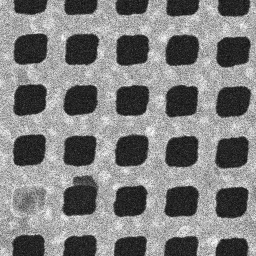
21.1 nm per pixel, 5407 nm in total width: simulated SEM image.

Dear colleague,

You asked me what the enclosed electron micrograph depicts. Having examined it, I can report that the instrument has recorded a regular array of holes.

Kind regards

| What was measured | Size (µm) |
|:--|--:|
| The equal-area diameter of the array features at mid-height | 0.728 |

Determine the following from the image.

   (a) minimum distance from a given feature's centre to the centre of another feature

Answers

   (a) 1050 nm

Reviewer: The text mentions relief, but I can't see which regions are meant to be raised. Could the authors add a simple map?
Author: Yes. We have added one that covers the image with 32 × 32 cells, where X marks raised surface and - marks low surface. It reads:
XX----XX----XX-----XX----XX----X
XX---XXX----XXX---XXX----XX----X
XXXXXXXXXXXXXXXXXXXXXXXXXXXXXXXX
XXXXXXXXXXXXXXXXXXXXXXXXXXXXXXXX
XXX---XXX---XXX---XXXX--XXXXXXXX
XX----XX----XX-----XX----XX----X
XX----XX----XX-----XX----XX----X
XX---XXX----XXX---XXX----XX----X
XXXXXXXXXXXXXXXXXXXXXXXXXXXXXXXX
XXXXXXXXXXXXXXXXXXXXXXXXXXXXXXXX
XXXXXXXXXXXXXXXXXXXXXXXXXXXXXXXX
XX----XX----XXX----XX----XX----X
XX----XX----XX-----XX----XX----X
XX----XX----XX----XXX----XX----X
XXXXXXXXXXXXXXX--XXXX--XXXX---XX
XXXXXXXXXXXXXXXXXXXXXXXXXXXXXXXX
XXXXXXXXXXXXXXXXXXXXXXXXXXXXXXXX
XX----XX----XXX----XX----XXX---X
XX----XX----XX-----XX----XX----X
XX----XX----XX----XXX----XX----X
XX---XXX---XXXX---XXX---XXX----X
XXXXXXXXXXXXXXXXXXXXXXXXXXXXXXXX
XXXXXXXXX---XXXXXXXXXXXXXXXXXXXX
XXXXXXXXX---XXX---XXX---XXXX---X
XXXXXXXX----XX----XXX----XX----X
XXXXXXXX----XX----XXX----XX----X
XXXXXXXX----XX----XXX----XX----X
XXXXXXXXXXXXXXXXXXXXXXXXXXXXXXXX
XXXXXXXXXXXXXXXXXXXXXXXXXXXXXXXX
XX---XXXXX--XXXX-XXXXXXXXXXXXXXX
XX----XX----XX----XXX----XX----X
XX----XX----XX----XXX----XX----X